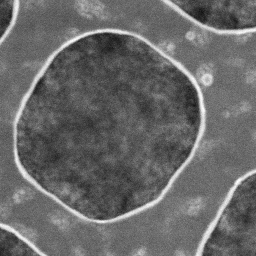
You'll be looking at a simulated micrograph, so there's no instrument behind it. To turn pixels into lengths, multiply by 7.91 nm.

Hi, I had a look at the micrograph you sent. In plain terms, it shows holes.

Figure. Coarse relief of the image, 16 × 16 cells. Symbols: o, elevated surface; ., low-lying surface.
.oooooooooo.....
.oooooooooooo...
ooooo....ooooooo
ooo.......oooooo
ooo.........oooo
oo..........oooo
oo...........ooo
o............ooo
o...........oooo
o...........oooo
o..........ooooo
oo.........oooo.
oooo......oooo..
ooooo...oooooo..
.oooooooooooo...
..ooooooooooo...